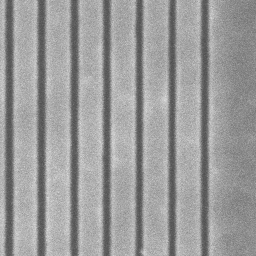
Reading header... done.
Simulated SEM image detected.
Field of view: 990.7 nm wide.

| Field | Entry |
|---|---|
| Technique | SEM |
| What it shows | parallel lines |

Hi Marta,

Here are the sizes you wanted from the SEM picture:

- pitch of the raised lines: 32.5 px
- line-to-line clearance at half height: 31 nm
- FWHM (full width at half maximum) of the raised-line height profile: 0.0929 microns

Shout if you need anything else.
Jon